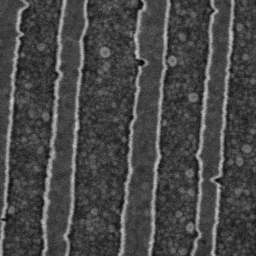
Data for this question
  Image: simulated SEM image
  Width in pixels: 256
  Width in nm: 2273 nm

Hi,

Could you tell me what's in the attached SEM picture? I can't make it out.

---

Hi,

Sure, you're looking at one or a few lines or trenches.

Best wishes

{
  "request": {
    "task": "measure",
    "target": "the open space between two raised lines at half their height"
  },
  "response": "398 nanometres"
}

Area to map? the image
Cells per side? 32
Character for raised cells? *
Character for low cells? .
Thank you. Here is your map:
***.....***.......***......**...
***.....***.......***......**...
**......***......****.....***...
**......***......****.....***...
***....***.......****.....***...
**.....***.......****.....***...
**.....***.......****.....***...
**.....***........**......***...
**.....***........***.....***...
**.....***.......***......**....
**.....***.......***......**....
**.....***.......***......**....
**.....***.......***......**....
*......***.......***......**....
*......***.......***.....***....
*......***......****.....***....
*......***......****.....***....
*......**.......****.....***....
*......**.......****.....***....
*.....***.......****.....***....
*.....***.......****.....***....
*.....***.......***......***....
*.....***.......***......**.....
*.....***.......***......**.....
*.....***.......***......**.....
*.....***.......***......**.....
......***......****......**.....
.....****......****......**.....
.....****......****......**.....
......**.......****......**.....
......***......****.....***.....
......**.......****.....***.....